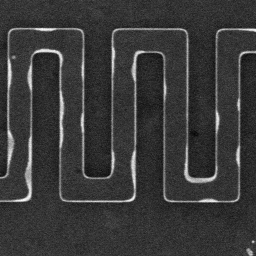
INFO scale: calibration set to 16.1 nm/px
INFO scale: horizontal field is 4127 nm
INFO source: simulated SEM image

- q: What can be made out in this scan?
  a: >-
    groups of lines, slits or small figures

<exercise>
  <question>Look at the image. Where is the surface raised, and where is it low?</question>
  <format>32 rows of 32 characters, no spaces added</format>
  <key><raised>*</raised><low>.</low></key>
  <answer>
................................
................................
................................
................................
.*********....*********....*****
.*********....*********....*****
.****..***....*********....*****
.***....**....***...***....***..
.***....**....***....**....***..
.***....**....***....**....***..
.***....**....***....**....***..
.***....**....***....**....***..
.***....**....***....**....***..
.***....**....***....**....***..
.***....**....***....**....***..
.***....**....***....**....***..
.***....**....***....**....***..
.***....**....***....**....***..
.***....**....***....**....***..
.***....**....***....**....***..
.***....**....***....**....***..
.***....***...***....**....***..
****....*********....***.*****..
****....*********....*********..
****....*********....*********..
................................
................................
................................
................................
................................
................................
................................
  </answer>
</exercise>